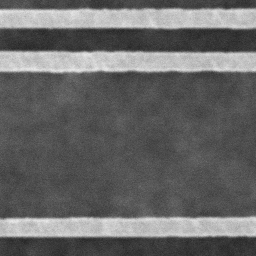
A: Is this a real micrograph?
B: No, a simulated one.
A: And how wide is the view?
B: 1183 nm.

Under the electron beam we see lines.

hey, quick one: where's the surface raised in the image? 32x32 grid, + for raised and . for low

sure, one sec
................................
++++++++++++++++++++++++++++++++
++++++++++++++++++++++++++++++++
................................
................................
................................
................................
++++++++++++++++++++++++++++++++
++++++++++++++++++++++++++++++++
................................
................................
................................
................................
................................
................................
................................
................................
................................
................................
................................
................................
................................
................................
................................
................................
................................
................................
++++++++++++++++++++++++++++++++
++++++++++++++++++++++++++++++++
+++++++++++++.+.+++++.++.+......
................................
................................